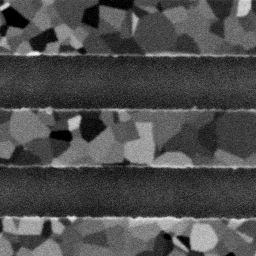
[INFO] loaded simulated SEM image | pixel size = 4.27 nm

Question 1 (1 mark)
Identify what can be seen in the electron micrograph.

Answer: lines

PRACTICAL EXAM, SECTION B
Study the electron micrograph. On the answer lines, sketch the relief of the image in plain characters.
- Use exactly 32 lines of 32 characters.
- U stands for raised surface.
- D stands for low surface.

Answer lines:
UUUUUUUUUUUUUUUUUUUUUUUUUUUUUUUU
UUUUUUUUUUUUUUUUUUUUUUUUUUUUUUUU
UUUUUUUUUUUUUUUUUUUUUUUUUUUUUUUU
UUUUUUUUUUUUUUUUUUUUUUUUUUUUUUUU
UUUUUUUUUUUUUUUUUUUUUUUUUUUUUUUU
UUUUUUUUUUUUUUUUUUUUUUUUUUUUUUUU
UUUUUUUUUUUUUUUUUUUUUUUUUUUUUUUU
DDDDDDDDDDDDDDDDDDDDDDDDDDDDDDDD
DDDDDDDDDDDDDDDDDDDDDDDDDDDDDDDD
DDDDDDDDDDDDDDDDDDDDDDDDDDDDDDDD
DDDDDDDDDDDDDDDDDDDDDDDDDDDDDDDD
DDDDDDDDDDDDDDDDDDDDDDDDDDDDDDDD
DDDDDDDDDDDDDDDDDDDDDDDDDDDDDDDD
DDDDDDDDDDDDDDDDDDDDDDDDDDDDDDDD
UUUUUUUUUUUUUUUUUUUUUUUUUUUUUUUU
UUUUUUUUUUUUUUUUUUUUUUUUUUUUUUUU
UUUUUUUUUUUUUUUUUUUUUUUUUUUUUUUU
UUUUUUUUUUUUUUUUUUUUUUUUUUUUUUUU
UUUUUUUUUUUUUUUUUUUUUUUUUUUUUUUU
UUUUUUUUUUUUUUUUUUUUUUUUUUUUUUUU
UUUUUUUUUUUUUUUUUUUUUUUUUUUUUUUU
DDDDDDDDDDDDDDDDDDDDDDDDDDDDDDDD
DDDDDDDDDDDDDDDDDDDDDDDDDDDDDDDD
DDDDDDDDDDDDDDDDDDDDDDDDDDDDDDDD
DDDDDDDDDDDDDDDDDDDDDDDDDDDDDDDD
DDDDDDDDDDDDDDDDDDDDDDDDDDDDDDDD
DDDDDDDDDDDDDDDDDDDDDDDDDDDDDDDD
UUUUUUUUUUUUUUUUUUUUUUUUUUUUUUUU
UUUUUUUUUUUUUUUUUUUUUUUUUUUUUUUU
UUUUUUUUUUUUUUUUUUUUUUUUUUUUUUUU
UUUUUUUUUUUUUUUUUUUUUUUUUUUUUUUU
UUUUUUUUUUUUUUUUUUUUUUUUUUUUUUUU